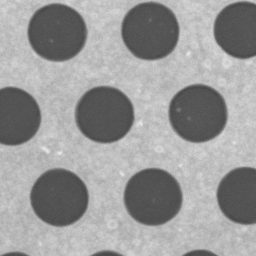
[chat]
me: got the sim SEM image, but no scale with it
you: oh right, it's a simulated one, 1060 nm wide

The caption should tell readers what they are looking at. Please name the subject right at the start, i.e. holes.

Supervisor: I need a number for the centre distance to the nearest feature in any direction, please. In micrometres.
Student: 0.387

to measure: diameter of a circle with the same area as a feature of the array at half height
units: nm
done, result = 243